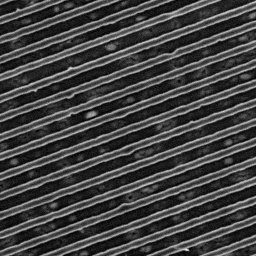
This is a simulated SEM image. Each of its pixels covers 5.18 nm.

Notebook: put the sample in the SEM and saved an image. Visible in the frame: parallel lines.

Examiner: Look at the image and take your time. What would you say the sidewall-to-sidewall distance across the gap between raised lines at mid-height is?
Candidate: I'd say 0.0584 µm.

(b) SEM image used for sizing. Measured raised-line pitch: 95 nm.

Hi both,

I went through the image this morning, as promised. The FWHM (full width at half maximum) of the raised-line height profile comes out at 34.1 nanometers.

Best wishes